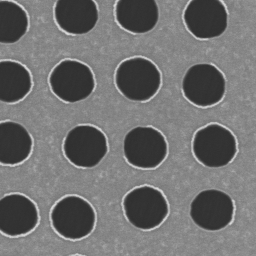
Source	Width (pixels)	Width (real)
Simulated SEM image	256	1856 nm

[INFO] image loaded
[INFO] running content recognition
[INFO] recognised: a regular array of holes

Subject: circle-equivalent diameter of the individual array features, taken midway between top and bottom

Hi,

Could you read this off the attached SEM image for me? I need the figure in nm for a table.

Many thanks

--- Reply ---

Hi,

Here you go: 299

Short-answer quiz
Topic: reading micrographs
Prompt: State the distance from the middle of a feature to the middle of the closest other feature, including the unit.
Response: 452 nm